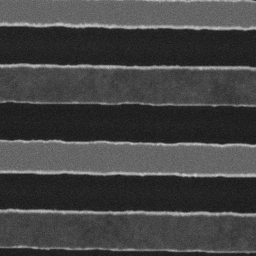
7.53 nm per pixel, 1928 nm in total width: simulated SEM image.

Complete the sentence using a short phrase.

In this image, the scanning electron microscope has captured lines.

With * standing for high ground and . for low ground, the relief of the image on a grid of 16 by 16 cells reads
****************
****************
................
................
****************
****************
......**********
................
................
****************
****************
................
................
****************
****************
..**************